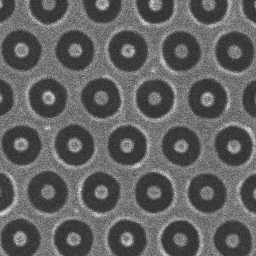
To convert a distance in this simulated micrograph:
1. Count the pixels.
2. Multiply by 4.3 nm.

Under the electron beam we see a regular array of ring-shaped grooves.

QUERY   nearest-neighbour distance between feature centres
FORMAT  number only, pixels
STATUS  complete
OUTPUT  53.3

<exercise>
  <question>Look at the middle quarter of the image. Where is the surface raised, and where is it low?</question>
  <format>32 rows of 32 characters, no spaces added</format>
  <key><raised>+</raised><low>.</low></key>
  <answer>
......+++++++.......++++++......
+....+++++++++.....++++++++....+
++++++++++++++++++++++++++++++++
+++++++++.++++++++++++++++++++++
++++++......++++++++.....+++++++
+++++........++++++........+++++
+++++.........++++.........++++.
.+++....+++...++++....++....+++.
.+++....+++...++++...+++....+++.
.+++....+++...++++...+++....+++.
.++++.........++++.........++++.
++++++........+++++........+++++
++++++.......+++++++......++++++
++++++++...++++++++++...++++++++
++++++++++++++++++++++++++++++++
.....++++++++++..+++++++++++..++
......++++++.......+++++++......
.......+++++........+++++.......
.......++++.........+++++.......
.+++....+++...+++....++++...++..
.+++....+++...+++....+++....+++.
..++....+++...+++....++++...+++.
.......++++.........+++++.......
.......+++++........+++++.......
......+++++++......++++++++.....
+++++++++++++++++++++++++++++..+
++++++++++++++++++++++++++++++++
+++++++....++++++++++...++++++++
++++++.......++++++.......++++++
+++++........+++++.........+++++
.++++....+....++++.........++++.
.+++....+++...++++...+++...++++.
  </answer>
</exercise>